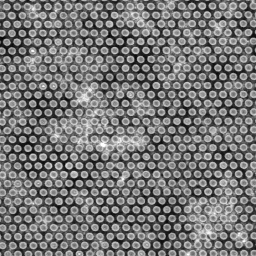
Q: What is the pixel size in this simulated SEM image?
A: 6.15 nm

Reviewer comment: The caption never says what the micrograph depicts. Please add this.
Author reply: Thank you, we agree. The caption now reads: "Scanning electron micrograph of a regular array of raised bodies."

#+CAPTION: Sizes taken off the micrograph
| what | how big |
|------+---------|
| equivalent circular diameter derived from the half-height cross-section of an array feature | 0.0439 µm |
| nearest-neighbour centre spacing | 61.3 nm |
